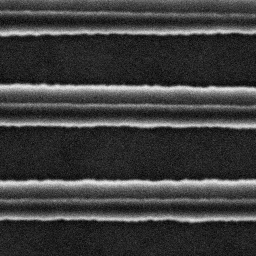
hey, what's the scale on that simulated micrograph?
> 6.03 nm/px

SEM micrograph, lines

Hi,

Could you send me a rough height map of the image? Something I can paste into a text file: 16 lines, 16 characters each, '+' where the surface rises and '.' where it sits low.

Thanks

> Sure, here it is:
++++++++++++++++
++++++++++++++++
................
................
................
++++++++.+.+....
++++++++++++++++
++++++++++++++++
................
................
................
++++++++++++++++
++++++++++++++++
++++++++++++++++
................
................